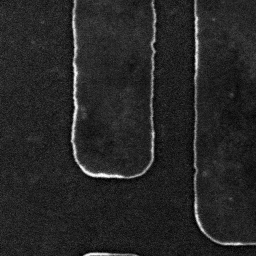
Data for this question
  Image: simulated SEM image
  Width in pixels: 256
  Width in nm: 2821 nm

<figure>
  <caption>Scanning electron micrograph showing one or a few lines or trenches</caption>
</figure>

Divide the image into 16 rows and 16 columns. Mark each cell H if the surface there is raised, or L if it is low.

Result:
LLLLLHHHHHLLHHHH
LLLLLHHHHHLLHHHH
LLLLLHHHHHLLHHHH
LLLLLHHHHHLLHHHH
LLLLLHHHHHLLHHHH
LLLLLHHHHHLLHHHH
LLLLLHHHHHLLHHHH
LLLLLHHHHHLLHHHH
LLLLLHHHHHLLHHHH
LLLLLHHHHHLLHHHH
LLLLLHHHHLLLHHHH
LLLLLLLLLLLLHHHH
LLLLLLLLLLLLHHHH
LLLLLLLLLLLLHHHH
LLLLLLLLLLLLLHHH
LLLLLLLLLLLLLLLL